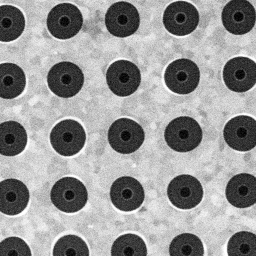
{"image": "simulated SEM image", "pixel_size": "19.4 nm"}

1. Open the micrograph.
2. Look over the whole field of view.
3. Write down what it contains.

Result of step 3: an array of small figures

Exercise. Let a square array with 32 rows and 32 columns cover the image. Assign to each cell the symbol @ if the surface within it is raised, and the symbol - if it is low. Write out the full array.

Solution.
@@@@@@@--@@@@@--@@@@@---@@@@---@
---@@@----@@@----@@@-----@@@----
---@@@----@@@-----@@-----@@@----
---@@@----@@@----@@@@----@@@----
---@@@@--@@@@@--@@@@@@-@@@@@@@@@
@@@@@@@@@@@@@@@@@@@@@@@@@@@@@@@@
@@@@@@@@@@@@@@@@@@@@@@@@@@@@@@@@
@@@@@@@@@@@@@@@-@@@@@@--@@@@@---
---@@@----@@@----@@@@----@@@----
---@@@----@@@-----@@-----@@@----
---@@@----@@@-----@@@----@@@----
---@@@----@@@@---@@@@---@@@@@--@
@@@@@@@@@@@@@@@@@@@@@@@@@@@@@@@@
@@@@@@@@@@@@@@@@@@@@@@@@@@@@@@@@
@@@@@@@@@@@@@@@@@@@@@@@@@@@@@--@
---@@@@---@@@@---@@@@----@@@----
---@@@-----@@-----@@@----@@@----
----@@-----@@-----@@@----@@@----
---@@@@---@@@@---@@@@---@@@@@---
@-@@@@@@-@@@@@@@@@@@@@@@@@@@@@@@
@@@@@@@@@@@@@@@@@@@@@@@@@@@@@@@@
@@@@@@@@@@@@@@@@@@@@@@@@@@@@@@@@
--@@@@@---@@@@---@@@@----@@@@---
---@@@-----@@@----@@@----@@@----
----@@-----@@@----@@@----@@@----
----@@@----@@@----@@@----@@@@---
---@@@@@--@@@@@-@@@@@@@@@@@@@@@@
@@@@@@@@@@@@@@@@@@@@@@@@@@@@@@@@
@@@@@@@@@@@@@@@@@@@@@@@@@@@@@@@@
@@@@@@@@--@@@@@---@@@@---@@@@---
---@@@@----@@@----@@@----@@@----
----@@-----@@@----@@@-----@@----